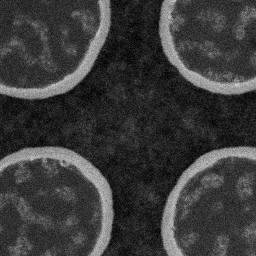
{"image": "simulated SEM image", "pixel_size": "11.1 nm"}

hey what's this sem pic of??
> raised bodies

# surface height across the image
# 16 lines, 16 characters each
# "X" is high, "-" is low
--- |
XXXXXXX---XXXXXX
XXXXXXX---XXXXXX
XXXXXX----XXXXXX
XXXXXX-----XXXXX
XXXXX-------XXXX
XXXX---------XX-
----------------
----------------
----------------
----------------
XXXXX-------XXXX
XXXXXX-----XXXXX
XXXXXXX----XXXXX
XXXXXXX----XXXXX
XXXXXXX---XXXXXX
XXXXXX-----XXXXX